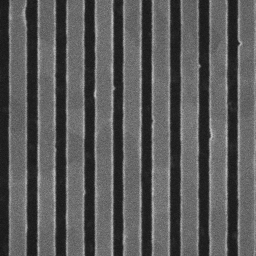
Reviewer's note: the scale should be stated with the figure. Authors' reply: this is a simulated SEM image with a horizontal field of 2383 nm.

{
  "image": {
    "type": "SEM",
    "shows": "parallel lines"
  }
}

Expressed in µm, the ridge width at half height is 0.164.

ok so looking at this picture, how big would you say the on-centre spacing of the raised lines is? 0.266 µm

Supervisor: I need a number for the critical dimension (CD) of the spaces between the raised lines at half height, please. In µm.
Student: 0.107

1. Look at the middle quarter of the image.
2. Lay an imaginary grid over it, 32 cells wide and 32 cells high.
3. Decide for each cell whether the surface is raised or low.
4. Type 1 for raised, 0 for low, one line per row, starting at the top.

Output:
01111000111100011110001111000111
01111000111100011110001111000111
01111000111100011110001111000111
01111000111100011110001111000111
01111000111100011110001111000111
01111000111100011110001111000111
01111000111100011110001111000111
01111000111100011110001111000111
01111000111100011110001111000111
01111000111100011110001111000111
01111000111100011110001111000111
01111000111100011110001111000111
01111000111100011110001111000111
01111000111100011110001111000111
01111000111100011110001111000111
01111000111100011110001111000111
01111000111100011110001111000111
01111000111100011110001111000111
01111000111100011110001111000111
01111000111100011110001111000111
01111000111100011110001111000111
01111000111100011110001111000111
01111000111100011110001111000111
01111000111100011110001111000111
01111000111100011110001111000111
01111000111100011110001111000111
01111000111100011110001111000111
01111000111100011110001111000111
01111000111100011110001111000111
01111000111100011110001111000111
01111000111100011110001111000111
01111000111100011110001111000111